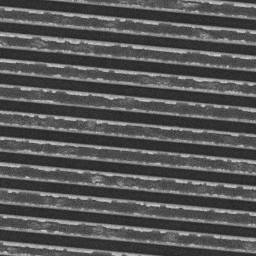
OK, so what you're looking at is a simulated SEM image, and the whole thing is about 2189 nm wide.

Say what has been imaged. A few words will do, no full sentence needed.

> parallel lines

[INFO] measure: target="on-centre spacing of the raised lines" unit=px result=25.9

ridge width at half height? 121 nm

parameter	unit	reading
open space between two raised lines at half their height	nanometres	106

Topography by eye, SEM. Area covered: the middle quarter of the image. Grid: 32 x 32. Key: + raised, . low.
+...............................
++++++++++++....................
++++++++++++++++++++++..........
++++++++++++++++++++++++++++++++
..........++++++++++++++++++++++
....................++++++++++++
...............................+
+++++++++.......................
+++++++++++++++++++.............
++++++++++++++++++++++++++++++..
.....+++++++++++++++++++++++++++
...............+++++++++++++++++
..........................++++++
+...............................
++++++++++++....................
++++++++++++++++++++++..........
++++++++++++++++++++++++++++++++
..........++++++++++++++++++++++
....................++++++++++++
...............................+
+++++++.........................
+++++++++++++++++...............
++++++++++++++++++++++++++++....
.....+++++++++++++++++++++++++++
...............+++++++++++++++++
..........................++++++
+...............................
++++++++++++....................
++++++++++++++++++++++..........
++++++++++++++++++++++++++++++++
..........++++++++++++++++++++++
.....................+++++++++++